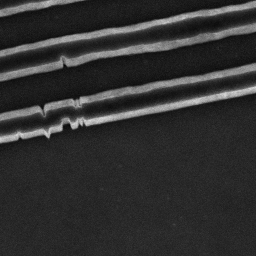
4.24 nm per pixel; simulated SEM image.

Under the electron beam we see one or a few lines or trenches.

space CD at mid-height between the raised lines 166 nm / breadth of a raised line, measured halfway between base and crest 96.7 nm